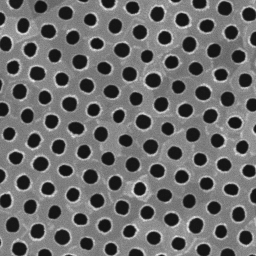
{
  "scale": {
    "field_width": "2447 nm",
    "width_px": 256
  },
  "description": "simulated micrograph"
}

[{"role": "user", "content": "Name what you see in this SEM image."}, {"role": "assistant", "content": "a regular array of holes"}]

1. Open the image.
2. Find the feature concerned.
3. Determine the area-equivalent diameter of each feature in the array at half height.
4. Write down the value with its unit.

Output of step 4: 134 nanometres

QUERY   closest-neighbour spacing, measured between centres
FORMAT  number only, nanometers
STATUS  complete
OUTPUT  237